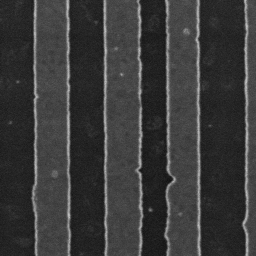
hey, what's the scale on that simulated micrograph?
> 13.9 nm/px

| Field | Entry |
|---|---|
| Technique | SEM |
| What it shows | one or a few lines or trenches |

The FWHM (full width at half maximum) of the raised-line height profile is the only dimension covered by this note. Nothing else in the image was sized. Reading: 471 nm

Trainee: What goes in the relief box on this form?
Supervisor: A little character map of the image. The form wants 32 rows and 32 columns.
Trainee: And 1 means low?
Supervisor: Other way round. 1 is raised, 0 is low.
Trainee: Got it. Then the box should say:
00001111000001111000011110000001
00001111000001111000011110000001
00001111000001111000011110000001
00001111000001111000011110000001
00001111000001111000011110000001
00001111100001111000011110000001
00001111100001111000011110000001
00001111100001111000011110000001
00001111100001111100011110000001
00001111100001111000011110000001
00001111100001111000011110000001
00001111100001111000011110000001
00001111100001111000011110000001
00001111100001111100011110000001
00001111100001111100011110000001
00001111100001111000011110000001
00001111100001111100011110000001
00001111100001111100011110000001
00001111100001111100011110000001
00001111100001111100011110000001
00001111100001111100011110000001
00001111100001111000011110000001
00001111100001111100001110000001
00001111100001111100011110000001
00001111100001111100011110000001
00001111100001111100011110000001
00001111100001111100011110000001
00001111100001111100011110000001
00001111100001111100011110000001
00000111100001111100011110000001
00000111100001111100011110000001
00000111100001111100011110000001